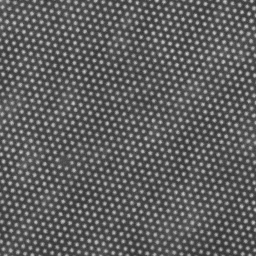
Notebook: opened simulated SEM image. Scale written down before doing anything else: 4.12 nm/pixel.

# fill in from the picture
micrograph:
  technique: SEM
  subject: a regular array of raised bodies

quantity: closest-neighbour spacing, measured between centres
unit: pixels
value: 7.14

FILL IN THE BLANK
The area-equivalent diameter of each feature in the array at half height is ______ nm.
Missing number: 14.7